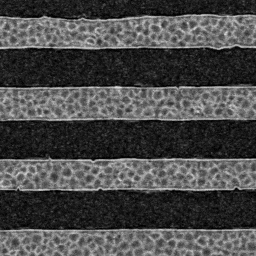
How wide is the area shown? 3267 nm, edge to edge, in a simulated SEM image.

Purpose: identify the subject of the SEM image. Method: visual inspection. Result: one or a few lines or trenches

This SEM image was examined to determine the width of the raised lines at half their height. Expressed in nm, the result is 383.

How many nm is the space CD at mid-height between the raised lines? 518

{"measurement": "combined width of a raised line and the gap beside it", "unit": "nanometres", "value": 904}